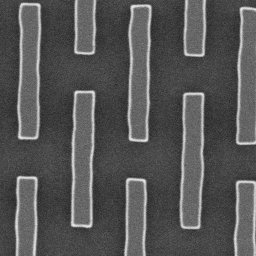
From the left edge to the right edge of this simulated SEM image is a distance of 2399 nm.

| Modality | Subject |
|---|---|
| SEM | groups of lines, slits or small figures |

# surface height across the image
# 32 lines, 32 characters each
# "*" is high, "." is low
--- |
...*.....***...........***......
..***....***.....**....***....**
..***....***....***....***....**
...**....***....***....***....**
...**.....**....***....***....**
...**....***....***....**.....**
...**.....**....***....**.....**
...**...........**............**
...**...........**............**
...**...........**............**
..***...........**............**
..***.....*.....**............**
..***....***....**.....**.....**
..***....***....**.....**.....**
..***....***....**.....**.....**
..***....***....**.....**.....**
..***....***....**.....**.....**
.........***.....*.....**.....**
.........***...........**.......
.........***...........**.......
.........**............**.......
.........**............**.......
..**.....**.....**.....**.......
..***....**.....**.....**.....**
..**.....**.....**.....**.....**
..**.....**.....**.....**.....**
..**.....**.....**.....**.....**
..**.....**.....**.....**.....**
..**............**............**
..**............**...........***
..**............**...........***
..**............**............**